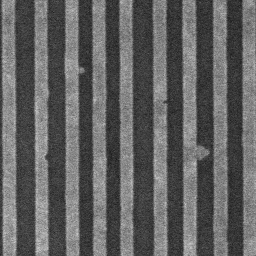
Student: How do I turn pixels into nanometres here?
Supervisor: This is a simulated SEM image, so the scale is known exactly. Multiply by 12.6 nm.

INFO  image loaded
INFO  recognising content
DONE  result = parallel lines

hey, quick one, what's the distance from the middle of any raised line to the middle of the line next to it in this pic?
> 379 nm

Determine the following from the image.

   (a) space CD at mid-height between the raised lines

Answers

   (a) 228 nm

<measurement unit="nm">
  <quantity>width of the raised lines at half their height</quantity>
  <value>148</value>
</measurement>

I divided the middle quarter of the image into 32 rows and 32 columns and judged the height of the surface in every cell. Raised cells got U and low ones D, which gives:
UUUDDDDUUUDDDDUUUDDDDDDUUDDDDDUU
UUUDDDDDUUDDDDUUUDDDDDDUUDDDDDUU
UUUDDDDUUUDDDDUUUDDDDDDUUDDDDDUU
DUUDDDDUUUDDDDUUUDDDDDDUUDDDDDUU
DUUDDDDUUUDDDDUUUDDDDDDUUDDDDDUU
DUUDDDDUUUDDDDUUUDDDDDDUUDDDDDUU
DUUDDDDUUUDDDDUUUDDDDDDUUDDDDDUU
DUUDDDDUUUDDDDUUUDDDDDDUUDDDDDUU
DUUDDDDUUUDDDDUUUDDDDDDUUDDDDDUU
DUUDDDDUUUDDDDUUUDDDDDDUUDDDDDUU
DUUDDDDUUUDDDDUUUDDDDDDUUDDDDDUU
DUUDDDDUUUDDDDUUUDDDDDDUUDDDDDUU
DUUDDDDUUUDDDDUUUDDDDDDUUDDDDDUU
DUUDDDDUUUDDDDUUUDDDDDDUUDDDDDUU
DUUDDDDUUUDDDDUUUDDDDDDUUDDDDDUU
DUUDDDDUUUDDDDUUUDDDDDDUUDDDDDUU
DUUDDDDUUUDDDDUUUDDDDDDUUDDDDDUU
DUUDDDDUUUDDDDUUUDDDDDDUUUDDDDUU
DUUDDDDUUUDDDDUUUDDDDDDUUUDDDDUU
DUUDDDDUUUDDDDUUUDDDDDDUUUDDDDUU
DUUDDDDUUUDDDDUUUDDDDDDUUUDDDDUU
DUUUDDDUUUDDDDUUUDDDDDDUUUDDDDUU
DUUUDDDUUUDDDDUUUDDDDDDUUUDDDDUU
DUUUDDDDUUDDDDUUUDDDDDDUUUDDDDUU
DUUUDDDUUUDDDDUUUDDDDDDUUUDDDDUU
DUUDDDDDUUDDDDUUUDDDDDDUUDDDDDUU
DUUDDDDUUUDDDDUUUDDDDDDUUDDDDDUU
DUUDDDDUUUDDDDUUUDDDDDDUUUDDDDUU
DUUDDDDUUUDDDDUUUDDDDDDUUUDDDDUU
DUUDDDDUUUDDDDUUUDDDDDDUUUDDDDUU
DUUDDDDUUUDDDDUUUDDDDDDUUUDDDDUU
DUUDDDDUUUDDDDUUUDDDDDDUUUDDDDUU